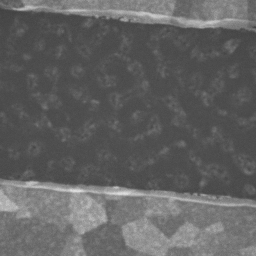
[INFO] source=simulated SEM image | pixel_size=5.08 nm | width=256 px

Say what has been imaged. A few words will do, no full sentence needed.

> one or a few lines or trenches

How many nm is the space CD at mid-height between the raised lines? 914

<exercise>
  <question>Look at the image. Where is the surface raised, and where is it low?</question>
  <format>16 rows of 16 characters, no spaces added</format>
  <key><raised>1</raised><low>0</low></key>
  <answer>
0101111111111111
0000000000001000
0000000000000000
0000000000000000
0000000000000000
0000000000000000
0000000000000000
0000000000000000
0000000000000000
0000000000000000
0000000000000000
0000000000000000
1111111111110000
1111111111111111
1111111111111111
1111111111111111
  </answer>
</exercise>